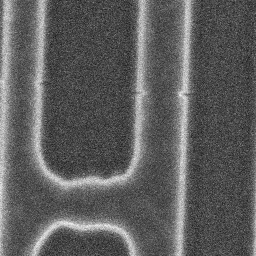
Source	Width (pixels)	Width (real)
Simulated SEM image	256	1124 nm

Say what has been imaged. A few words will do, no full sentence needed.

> one or a few lines or trenches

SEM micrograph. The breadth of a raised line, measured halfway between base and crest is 210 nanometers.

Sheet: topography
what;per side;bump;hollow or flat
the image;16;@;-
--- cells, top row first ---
@@@------@@@----
@@@------@@@----
@@@------@@@----
@@@------@@@----
@@@------@@@----
@@-------@@@----
@@-------@@@----
@@-------@@@----
@@-------@@@----
@@------@@@-----
@@@-----@@@-----
@@@@@@@@@@@-----
@@@@@@@@@@@-----
@@@@@@@@@@@-----
@@@----@@@@-----
@@------@@@-----